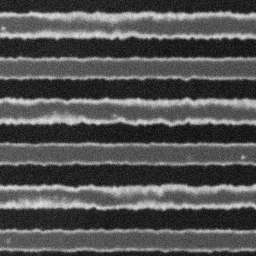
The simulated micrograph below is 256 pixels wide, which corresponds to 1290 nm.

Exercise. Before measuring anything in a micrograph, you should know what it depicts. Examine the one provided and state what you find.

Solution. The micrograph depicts lines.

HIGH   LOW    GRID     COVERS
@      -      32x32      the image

--------------------------------
--------------------------------
@@@@@@@@@@@@@@@@@@@@@@@@@@@@@@@@
@@@@@@@@@@@@@@@@@@@@@@@@@@@@@@@@
@@@@@@@@@@@@@@@@@@@@@@@@@@@@@@@@
--------------------------------
--------------------------------
@@@@@@@@@@@@@@@@@@@@@@@@@@@@@@@@
@@@@@@@@@@@@@@@@@@@@@@@@@@@@@@@@
@@@@@@@@@@@@@@@@@@@@@@@@@@@@@@@@
--------------------------------
--------------------------------
@@@--@@@-----@---------@--------
@@@@@@@@@@@@@@@@@@@@@@@@@@@@@@@@
@@@@@@@@@@@@@@@@@@@@@@@@@@@@@@@@
----------------@@@--@@------@-@
--------------------------------
--------------------------------
@@@@@@@@@@@@@@@@@@@@@@@@@@@@@@@@
@@@@@@@@@@@@@@@@@@@@@@@@@@@@@@@@
@@@-@@@@@-@@@---@@@@@@@@@@@@@-@@
--------------------------------
--------------------------------
@@@@@@@@@@@@@----@@@@@@@-@@@@@@@
@@@@@@@@@@@@@@@@@@@@@@@@@@@@@@@@
@@@@@@@@@@@@@@@@@@@@@@@@@@@@@@@@
--------------------------------
--------------------------------
--------------------------------
@@@@@@@@@@@@@@@@@@@@@@@@@@@@@@@@
@@@@@@@@@@@@@@@@@@@@@@@@@@@@@@@@
--------------------------------